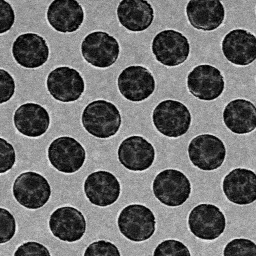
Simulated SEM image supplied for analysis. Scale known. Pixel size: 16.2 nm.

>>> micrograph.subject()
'a regular array of holes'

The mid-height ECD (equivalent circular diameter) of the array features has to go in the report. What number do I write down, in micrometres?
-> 0.595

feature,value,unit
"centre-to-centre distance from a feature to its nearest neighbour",792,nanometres